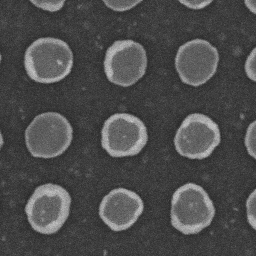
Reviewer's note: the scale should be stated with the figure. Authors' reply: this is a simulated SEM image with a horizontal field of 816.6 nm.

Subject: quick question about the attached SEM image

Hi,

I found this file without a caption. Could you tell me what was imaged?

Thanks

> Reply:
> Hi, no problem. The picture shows a regular array of raised bodies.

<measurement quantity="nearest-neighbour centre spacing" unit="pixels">71.1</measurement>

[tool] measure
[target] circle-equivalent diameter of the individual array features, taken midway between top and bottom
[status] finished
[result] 139 nm